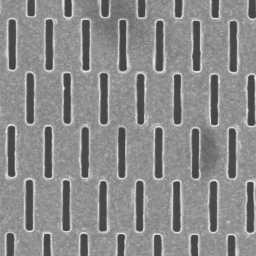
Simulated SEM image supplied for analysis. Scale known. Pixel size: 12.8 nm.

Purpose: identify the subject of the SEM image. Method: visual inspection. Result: a regular array of holes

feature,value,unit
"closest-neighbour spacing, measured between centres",470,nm